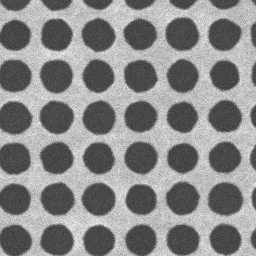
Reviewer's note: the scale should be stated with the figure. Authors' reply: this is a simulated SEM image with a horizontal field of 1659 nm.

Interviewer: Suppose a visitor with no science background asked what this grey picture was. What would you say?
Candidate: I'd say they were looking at a regular array of holes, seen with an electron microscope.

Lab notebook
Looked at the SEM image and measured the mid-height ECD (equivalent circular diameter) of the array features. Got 32.5 px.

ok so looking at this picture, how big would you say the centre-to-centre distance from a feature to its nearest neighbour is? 266 nm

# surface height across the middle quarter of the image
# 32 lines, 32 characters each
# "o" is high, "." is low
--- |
.ooooo......oooo......ooooo.....
..ooo.......ooo........ooo......
..ooo........oo........ooo......
..ooo........oo........ooo......
..ooo.......ooo........ooo......
.oooo.......oooo.......oooo.....
oooooo.....oooooo.....ooooo.....
oooooooooooooooooooooooooooooooo
oooooooooooooooooooooooooooooooo
oooooooo...ooooooo...ooooooooooo
.ooooo......oooo......ooooo.....
..ooo........oo........ooo......
...oo........oo........ooo......
...o.........oo........ooo......
..ooo........oo........ooo......
..ooo.......oooo......oooo......
.ooooo......ooooo....ooooooo....
ooooooo...oooooooooooooooooooooo
oooooooooooooooooooooooooooooooo
oooooooooooooooooo..oooooooooooo
.ooooo.....ooooo......ooooo.....
..ooo.......oooo.......ooo......
..ooo.......ooo........ooo......
..ooo........oo........ooo......
..ooo........oo........ooo......
..ooo.......oooo.......ooo......
.ooooo......oooo......oooooo....
oooooooo.ooooooooo...ooooooooooo
oooooooooooooooooooooooooooooooo
ooooooooooooooooooooooooooooo..o
.ooooo.....oooooo....oooooo.....
..ooo.......oooo.......ooo......